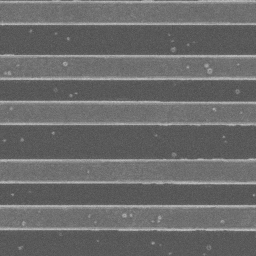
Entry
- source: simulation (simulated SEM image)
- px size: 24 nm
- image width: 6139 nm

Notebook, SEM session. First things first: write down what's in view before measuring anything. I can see lines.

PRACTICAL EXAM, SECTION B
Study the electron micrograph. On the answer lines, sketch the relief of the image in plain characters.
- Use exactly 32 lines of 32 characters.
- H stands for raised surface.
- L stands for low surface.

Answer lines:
HHHHHHHHHHHHHHHHHHHHHHHHHHHHHHHH
HHHHHHHHHHHHHHHHHHHHHHHHHHHHHHHH
HHHHHHHHHHHHHHHHHHHHHHHHHHHHHHHH
LLLLLLLLLLLLLLLLLLLLLLLLLLLLLLLL
LLLLLLLLLLLLLLLLLLLLLLLLLLLLLLLL
LLLLLLLLLLLLLLLLLLLLLLLLLLLLLLLL
LLLLLLLLLLLLLLLLLLLLLLLLLLLLLLLL
HHHHHHHHHHHHHHHHHHHHHHHHHHHHHHHH
HHHHHHHHHHHHHHHHHHHHHHHHHHHHHHHH
HHHHHHHHHHHHHHHHHHHHHHHHHHHHHHHH
LLLLLLLLLLLLLLLLLLLLLLLLLLLLLLLL
LLLLLLLLLLLLLLLLLLLLLLLLLLLLLLLL
LLLLLLLLLLLLLLLLLLLLLLLLLLLLLLLL
HHHHHHHHHHHHHHHHHHHHHHHHHHHHHHHH
HHHHHHHHHHHHHHHHHHHHHHHHHHHHHHHH
HHHHHHHHHHHHHHHHHHHHHHHHHHHHHHHH
LLLLLLLLLLLLLLLLLLLLLLLLLLLLLLLL
LLLLLLLLLLLLLLLLLLLLLLLLLLLLLLLL
LLLLLLLLLLLLLLLLLLLLLLLLLLLLLLLL
LLLLLLLLLLLLLLLLLLLLLLLLLLLLLLLL
HHHHHHHHHHHHHHHHHHHHHHHHHHHHHHHH
HHHHHHHHHHHHHHHHHHHHHHHHHHHHHHHH
HHHHHHHHHHHHHHHHHHHHHHHHHHHHHHHH
LLLLLLLLLLLLLLLLLLLLLLLLLLLLLLLL
LLLLLLLLLLLLLLLLLLLLLLLLLLLLLLLL
LLLLLLLLLLLLLLLLLLLLLLLLLLLLLLLL
HHHHHHHHHHHHHHHHHHHHHHHHHHHHHHHH
HHHHHHHHHHHHHHHHHHHHHHHHHHHHHHHH
HHHHHHHHHHHHHHHHHHHHHHHHHHHHHHHH
LLLLLLLLLLLLLLLLLLLLLLLLLLLLLLLL
LLLLLLLLLLLLLLLLLLLLLLLLLLLLLLLL
LLLLLLLLLLLLLLLLLLLLLLLLLLLLLLLL